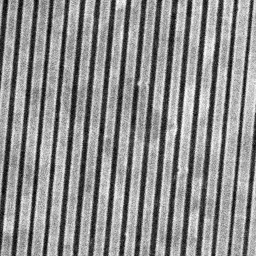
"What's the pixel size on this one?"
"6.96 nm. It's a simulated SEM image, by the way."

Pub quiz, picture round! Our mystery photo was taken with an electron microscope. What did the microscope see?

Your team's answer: parallel lines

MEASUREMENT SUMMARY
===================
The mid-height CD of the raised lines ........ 0.0615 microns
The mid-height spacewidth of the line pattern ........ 7.1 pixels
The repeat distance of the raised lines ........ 107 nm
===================